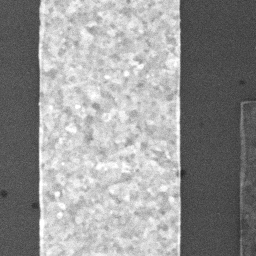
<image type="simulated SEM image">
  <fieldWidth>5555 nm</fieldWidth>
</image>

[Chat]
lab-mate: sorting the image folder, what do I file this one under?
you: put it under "wiring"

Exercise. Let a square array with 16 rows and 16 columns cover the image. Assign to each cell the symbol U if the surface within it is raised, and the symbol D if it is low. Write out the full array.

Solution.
DDDUUUUUUUUDDDDD
DDDUUUUUUUUDDDDD
DDDUUUUUUUUDDDDD
DDUUUUUUUUUDDDDD
DDDUUUUUUUUDDDDD
DDUUUUUUUUUDDDDD
DDUUUUUUUUUDDDDU
DDDUUUUUUUUDDDDU
DDDUUUUUUUUDDDDU
DDDUUUUUUUUDDDDU
DDUUUUUUUUUDDDDU
DDDUUUUUUUUDDDDU
DDDUUUUUUUUDDDDU
DDDUUUUUUUUDDDDU
DDDUUUUUUUUDDDDU
DDDUUUUUUUUDDDDU